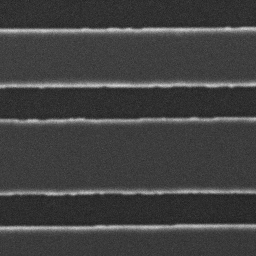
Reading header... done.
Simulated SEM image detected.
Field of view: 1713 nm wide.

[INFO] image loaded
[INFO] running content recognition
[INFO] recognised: lines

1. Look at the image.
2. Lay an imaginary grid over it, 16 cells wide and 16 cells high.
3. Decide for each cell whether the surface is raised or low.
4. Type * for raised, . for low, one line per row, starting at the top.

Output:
................
................
****************
****************
****************
................
................
....**..********
****************
****************
****************
****************
................
................
****************
****************